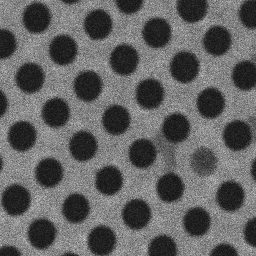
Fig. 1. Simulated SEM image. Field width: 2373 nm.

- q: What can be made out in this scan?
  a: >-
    a regular array of holes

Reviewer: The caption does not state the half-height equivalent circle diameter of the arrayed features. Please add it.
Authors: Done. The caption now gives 0.278 micrometres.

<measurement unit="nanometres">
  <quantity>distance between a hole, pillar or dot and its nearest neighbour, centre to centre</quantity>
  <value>392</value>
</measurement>